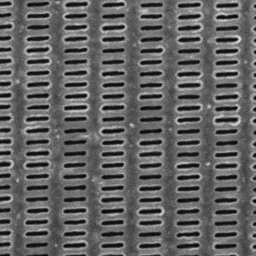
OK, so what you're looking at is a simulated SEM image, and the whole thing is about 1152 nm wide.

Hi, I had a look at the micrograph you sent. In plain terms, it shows a regular array of holes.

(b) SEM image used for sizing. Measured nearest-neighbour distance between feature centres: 50.4 nm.